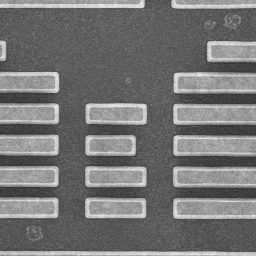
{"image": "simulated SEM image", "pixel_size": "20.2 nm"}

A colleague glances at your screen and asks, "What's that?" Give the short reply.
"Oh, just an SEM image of groups of lines, slits or small figures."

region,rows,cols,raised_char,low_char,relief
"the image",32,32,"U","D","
UUUUUUUUUUUUUUUUUUDDDDUUUUUUUUUU
DDDDDDDDDDDDDDDDDDDDDDDDDDDDDDDD
DDDDDDDDDDDDDDDDDDDDDDDDDDDDDDDD
DDDDDDDDDDDDDDDDDDDDDDDDDDDDDDDD
DDDDDDDDDDDDDDDDDDDDDDDDDDDDDDDD
DDDDDDDDDDDDDDDDDDDDDDDDDDUUUUUU
DDDDDDDDDDDDDDDDDDDDDDDDDDUUUUUU
DDDDDDDDDDDDDDDDDDDDDDDDDDDUUUDU
DDDDDDDDDDDDDDDDDDDDDDDDDDDDDDDD
UUUUUUUDDDDDDDDDDDDDDDUUUUUUUUUU
UUUUUUUDDDDDDDDDDDDDDDUUUUUUUUUU
DDDDDDDDDDDDDDDDDDDDDDDDDDDDDDUU
DDDDDDDDDDDDDDDDDDDDDDDDDDDDDDDD
UUUUUUUDDDDUUUUUUUDDDDUUUUUUUUUU
UUUUUUUDDDDUUUUUUUDDDDUUUUUUUUUU
DDDDDDDDDDDDDDDDDDDDDDDDDDDDDDDD
DDDDDDDDDDDDDDDDDDDDDDDDDDDDDDDD
UUUUUUUDDDDUUUUUUDDDDDUUUUUUUUUU
UUUUUUUDDDDUUUUUUDDDDDUUUUUUUUUU
DDDDDDDDDDDDDDDDDDDDDDDDDDDDDDDD
DDDDDDDDDDDDDDDDDDDDDDDDDDDDDDDD
UUUUUUUDDDDUUUUUUUDDDDUUUUUUUUUU
UUUUUUUDDDDUUUUUUUDDDDUUUUUUUUUU
DDDDDDDDDDDDDDDDDDDDDDDDDDDDDDDD
DDDDDDDDDDDDDDDDDDDDDDDDDDDDDDDD
UUUUUUUDDDDUUUUUUUDDDDUUUUUUUUUU
UUUUUUUDDDDUUUUUUUDDDDUUUUUUUUUU
DDDDDDDDDDDDDDDDDDDDDDDDDDDDDDDD
DDDDDDDDDDDDDDDDDDDDDDDDDDDDDDDD
DDDDDDDDDDDDDDDDDDDDDDDDDDDDDDDD
DDDDDDDDDDDDDDDDDDDDDDDDDDDDDDDD
DDDDDDDDDDDDDDDDDDDDDDDDDDDDDDDD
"